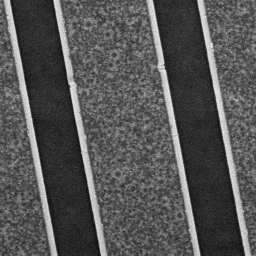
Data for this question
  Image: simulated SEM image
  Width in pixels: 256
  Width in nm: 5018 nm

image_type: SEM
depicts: one or a few lines or trenches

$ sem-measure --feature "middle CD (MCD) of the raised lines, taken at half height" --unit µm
1.83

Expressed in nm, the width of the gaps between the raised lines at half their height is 933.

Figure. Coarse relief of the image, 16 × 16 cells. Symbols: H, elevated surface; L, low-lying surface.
HLLLHHHHHLLLLHHH
HLLLHHHHHHLLLHHH
HLLLHHHHHHLLLHHH
HLLLHHHHHHLLLHHH
HLLLHHHHHHLLLHHH
HLLLHHHHHHLLLLHH
HHLLLHHHHHHLLLHH
HHLLLHHHHHHLLLHH
HHLLLHHHHHHLLLHH
HHLLLHHHHHHLLLHH
HHLLLHHHHHHLLLHH
HHHLLLHHHHHHLLLH
HHHLLLHHHHHHLLLH
HHHLLLHHHHHHLLLH
HHHLLLHHHHHHLLLH
HHHLLLHHHHHHLLLH